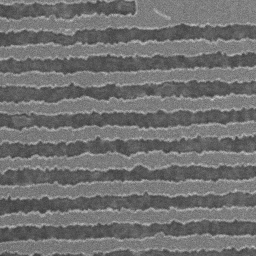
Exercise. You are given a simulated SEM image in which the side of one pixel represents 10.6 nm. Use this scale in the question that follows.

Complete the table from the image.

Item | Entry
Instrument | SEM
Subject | parallel lines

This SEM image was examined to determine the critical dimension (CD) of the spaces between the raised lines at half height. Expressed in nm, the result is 152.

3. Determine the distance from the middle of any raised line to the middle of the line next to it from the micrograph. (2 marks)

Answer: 294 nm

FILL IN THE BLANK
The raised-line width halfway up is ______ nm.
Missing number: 136